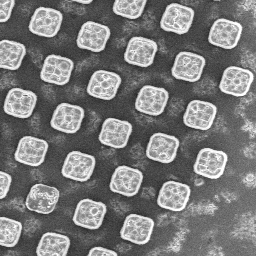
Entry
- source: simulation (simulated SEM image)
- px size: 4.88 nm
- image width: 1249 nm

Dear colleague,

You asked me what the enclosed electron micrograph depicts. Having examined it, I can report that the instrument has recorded a regular array of raised bodies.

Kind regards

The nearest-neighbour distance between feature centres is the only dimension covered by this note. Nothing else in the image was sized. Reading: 239 nm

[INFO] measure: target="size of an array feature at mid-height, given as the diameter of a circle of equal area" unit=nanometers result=142